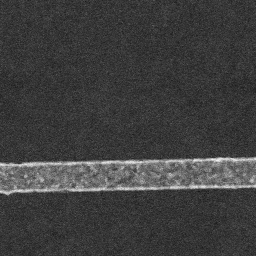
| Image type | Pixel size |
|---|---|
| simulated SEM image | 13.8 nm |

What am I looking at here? one or a few lines or trenches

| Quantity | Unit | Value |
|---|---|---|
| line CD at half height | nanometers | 375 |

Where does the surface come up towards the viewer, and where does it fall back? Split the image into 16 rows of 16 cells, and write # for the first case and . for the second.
................
................
................
................
................
................
................
................
................
................
################
################
................
................
................
................